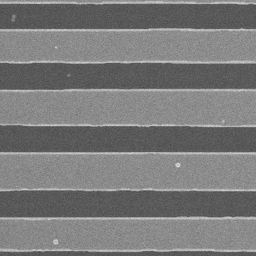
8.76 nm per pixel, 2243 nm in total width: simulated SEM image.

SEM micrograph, lines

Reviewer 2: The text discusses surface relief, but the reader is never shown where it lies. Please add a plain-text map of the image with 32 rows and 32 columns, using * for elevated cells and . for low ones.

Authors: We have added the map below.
...............................*
................................
................................
................................
********************************
********************************
********************************
********************************
................................
................................
................................
********************************
********************************
********************************
********************************
********************************
................................
................................
................................
********************************
********************************
********************************
********************************
********************************
................................
................................
................................
********************************
********************************
********************************
********************************
................................